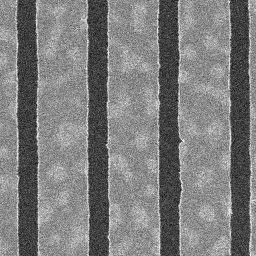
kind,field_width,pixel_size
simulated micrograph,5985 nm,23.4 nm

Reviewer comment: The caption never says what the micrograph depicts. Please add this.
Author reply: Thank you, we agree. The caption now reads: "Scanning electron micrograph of one or a few lines or trenches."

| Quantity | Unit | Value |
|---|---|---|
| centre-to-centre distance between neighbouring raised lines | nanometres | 1660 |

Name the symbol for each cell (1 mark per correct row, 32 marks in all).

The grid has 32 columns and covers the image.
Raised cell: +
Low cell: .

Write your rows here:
++...++++++...++++++..+++++++..+
++...++++++...++++++..+++++++..+
++...++++++...++++++..+++++++..+
++...++++++..+++++++..+++++++..+
++...++++++...++++++..+++++++..+
++...++++++...++++++..+++++++..+
++...++++++...++++++..+++++++..+
++...++++++...++++++..+++++++..+
++...++++++...++++++..+++++++..+
++...++++++...++++++...++++++..+
++...++++++...++++++..+++++++..+
++...++++++...++++++..+++++++..+
++...++++++..+++++++..+++++++..+
++...++++++..+++++++..+++++++..+
++...++++++...++++++..+++++++..+
++...++++++...++++++..+++++++..+
++...++++++...++++++..+++++++..+
++...++++++...++++++...++++++..+
++...++++++..+++++++..+++++++..+
++...++++++...++++++..+++++++..+
++...++++++...++++++...++++++..+
++...++++++...++++++...++++++..+
++...++++++...++++++...++++++..+
++...++++++...++++++...++++++..+
++...++++++...++++++...++++++..+
++...++++++...++++++...++++++..+
++...++++++...+++.++..+++++++..+
++...++++++...++++++..+++++++..+
++...++++++...++++++...++++++..+
++...++++++...++++++...++++++..+
++...++++++...++++++...++++++..+
++...++++++...++++++...++++++..+